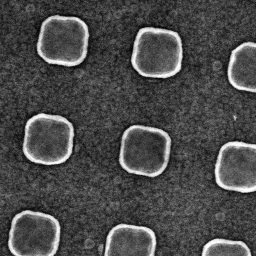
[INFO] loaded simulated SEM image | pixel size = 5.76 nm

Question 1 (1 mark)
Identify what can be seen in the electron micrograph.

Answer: raised bodies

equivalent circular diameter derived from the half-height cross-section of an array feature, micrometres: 0.288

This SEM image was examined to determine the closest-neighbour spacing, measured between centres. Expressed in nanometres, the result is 552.